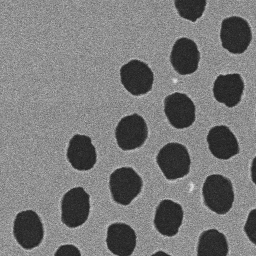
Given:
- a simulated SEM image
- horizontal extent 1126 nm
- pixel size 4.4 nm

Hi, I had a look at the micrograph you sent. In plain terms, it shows a regular array of holes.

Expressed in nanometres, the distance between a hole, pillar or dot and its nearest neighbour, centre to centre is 230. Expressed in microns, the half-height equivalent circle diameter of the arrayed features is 0.149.